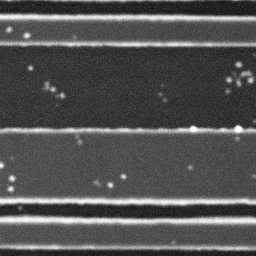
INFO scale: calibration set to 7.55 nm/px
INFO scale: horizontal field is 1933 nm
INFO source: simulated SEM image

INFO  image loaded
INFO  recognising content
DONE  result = lines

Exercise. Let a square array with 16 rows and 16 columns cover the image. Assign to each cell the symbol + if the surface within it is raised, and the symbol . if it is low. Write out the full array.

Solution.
++++++++++++++++
++++++++++++++++
++++++++++++++++
................
................
................
................
................
++++++++++++++++
++++++++++++++++
++++++++++++++++
++++++++++++++++
++++++++++++++++
++++++++++++++++
++++++++++++++++
.+++++++++++++++